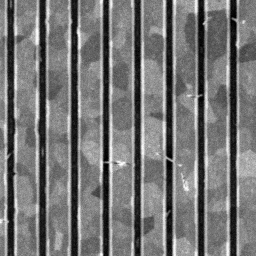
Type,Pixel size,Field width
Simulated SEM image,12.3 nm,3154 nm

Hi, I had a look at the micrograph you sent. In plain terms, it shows parallel lines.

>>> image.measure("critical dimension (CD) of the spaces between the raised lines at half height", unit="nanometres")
95.5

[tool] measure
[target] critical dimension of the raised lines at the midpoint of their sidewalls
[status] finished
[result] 296 nm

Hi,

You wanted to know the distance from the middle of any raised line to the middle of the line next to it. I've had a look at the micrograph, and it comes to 391 nm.